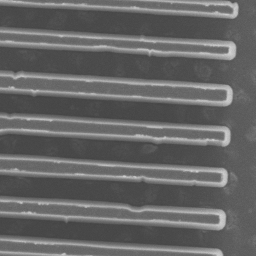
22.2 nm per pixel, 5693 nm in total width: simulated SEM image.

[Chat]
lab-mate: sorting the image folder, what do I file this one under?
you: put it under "parallel lines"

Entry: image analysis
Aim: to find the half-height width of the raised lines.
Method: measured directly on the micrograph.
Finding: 0.372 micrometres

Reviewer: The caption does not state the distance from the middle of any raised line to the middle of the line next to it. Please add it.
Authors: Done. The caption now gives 940 nm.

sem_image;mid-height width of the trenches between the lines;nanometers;558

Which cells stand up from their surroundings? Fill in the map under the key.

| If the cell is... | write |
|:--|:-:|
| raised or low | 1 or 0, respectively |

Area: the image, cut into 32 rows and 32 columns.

01111111111111111111111111111000
00000000000000000001111111111100
00000000000000000000000000000000
00000000000000000000000000000000
11111111111111000000000000000000
01111111111111111111111111111000
00000000000000000111111111111000
00000000000000000000000000000000
00000000000000000000000000000000
11111110000000000000000000000000
11111111111111111111111100000000
00111111111111111111111111111000
00000000000000000011111111111000
00000000000000000000000000000000
11110000000000000000000000000000
11111111111111111100000000000000
10111111111111111111111111110000
00000000000000000001111111110000
00000000000000000000000000000000
00000000000000000000000000000000
11111111111111110000000000000000
11111111111111111111111111110000
00000000000000000011111111110000
00000000000000000000000000000000
00000000000000000000000000000000
11111111111100000000000000000000
11111111111111111111111111100000
00000000000011111111111111110000
00000000000000000000000000000000
00000000000000000000000000000000
11111111111100000000000000000000
11111111111111111111111111100000